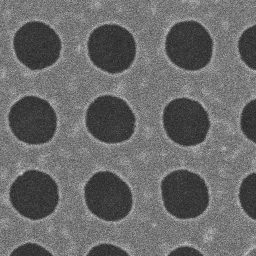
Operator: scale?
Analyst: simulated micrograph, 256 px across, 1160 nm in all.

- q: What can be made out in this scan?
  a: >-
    a regular array of holes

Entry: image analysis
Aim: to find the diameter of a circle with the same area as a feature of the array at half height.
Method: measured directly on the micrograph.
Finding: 49.8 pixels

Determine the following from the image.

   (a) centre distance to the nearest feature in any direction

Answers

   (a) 334 nm